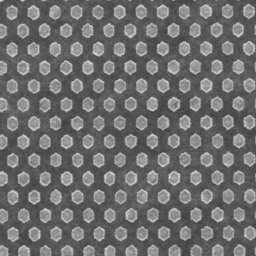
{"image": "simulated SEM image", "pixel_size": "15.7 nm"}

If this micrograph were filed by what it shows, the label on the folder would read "a regular array of raised bodies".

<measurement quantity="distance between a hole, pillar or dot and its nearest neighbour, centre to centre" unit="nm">332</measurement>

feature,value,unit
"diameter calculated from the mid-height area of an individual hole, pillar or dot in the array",11.9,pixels